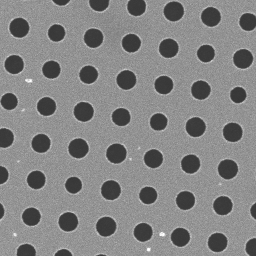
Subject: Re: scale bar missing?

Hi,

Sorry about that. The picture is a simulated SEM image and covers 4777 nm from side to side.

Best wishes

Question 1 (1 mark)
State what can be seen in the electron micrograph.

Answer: a regular array of holes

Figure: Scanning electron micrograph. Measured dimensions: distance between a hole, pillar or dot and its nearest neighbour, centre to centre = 690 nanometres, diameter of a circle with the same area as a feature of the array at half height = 0.363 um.